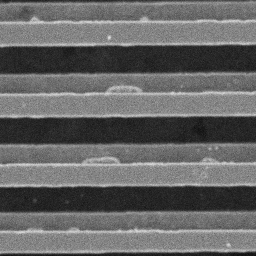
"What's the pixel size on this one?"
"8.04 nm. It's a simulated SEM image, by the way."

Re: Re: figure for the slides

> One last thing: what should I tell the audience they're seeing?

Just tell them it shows lines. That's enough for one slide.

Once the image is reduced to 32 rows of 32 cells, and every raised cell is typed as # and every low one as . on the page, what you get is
.###############################
################################
################################
################################
################################
############################.###
................................
................................
................................
################################
################################
################################
################################
################################
########################........
................................
................................
................................
################################
################################
################################
################################
################################
................................
................................
................................
............................#...
################################
################################
################################
################################
##############..##..............